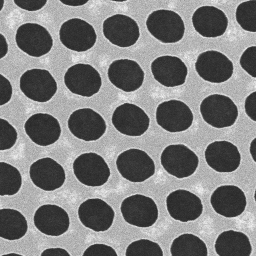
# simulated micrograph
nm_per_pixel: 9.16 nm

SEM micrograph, a regular array of holes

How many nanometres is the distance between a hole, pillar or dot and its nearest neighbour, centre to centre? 402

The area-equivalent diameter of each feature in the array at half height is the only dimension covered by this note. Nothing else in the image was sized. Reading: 317 nm